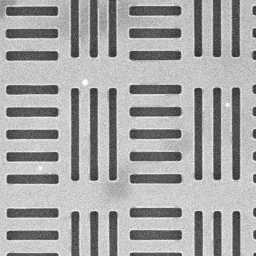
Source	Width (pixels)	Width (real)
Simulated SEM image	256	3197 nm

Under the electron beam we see groups of lines, slits or small figures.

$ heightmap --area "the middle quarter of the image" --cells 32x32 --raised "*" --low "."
********************************
********************************
********************************
********************************
********************************
****************.............***
**..***.***..***..............**
**..**...**..****............***
**..**...**..*******************
**..**...**..*******************
**..**...**..*******************
**..**...**..***.............***
**..**...**..***.............***
**..**...**..*******************
**..**...**..*******************
**..**...**..*******************
**..**...**..****............***
**..**...**..***..............**
**..**...**..****............***
**..**...**..*******************
**..**...**..*******************
**..**...**..*******************
**..**...**..***.............***
**..**...**..***..............**
**..**...**..****...........****
**..**...**..*******************
**..**...**..*******************
**..**...**..****............***
**..**...**..***..............**
*****************............***
********************************
********************************